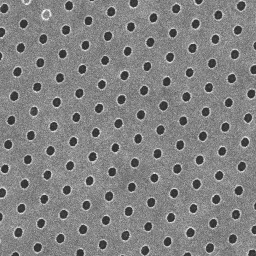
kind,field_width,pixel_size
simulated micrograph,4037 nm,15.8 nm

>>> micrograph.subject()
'a regular array of holes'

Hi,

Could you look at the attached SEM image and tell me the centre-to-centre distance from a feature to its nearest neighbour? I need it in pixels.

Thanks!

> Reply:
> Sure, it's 24.3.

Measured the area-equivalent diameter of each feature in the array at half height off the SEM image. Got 0.14 um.